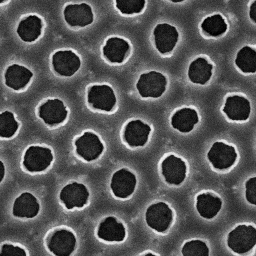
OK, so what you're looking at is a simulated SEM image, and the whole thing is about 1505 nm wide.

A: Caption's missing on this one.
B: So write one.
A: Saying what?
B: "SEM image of a regular array of holes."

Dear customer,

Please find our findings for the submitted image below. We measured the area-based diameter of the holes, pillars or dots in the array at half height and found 160 nanometers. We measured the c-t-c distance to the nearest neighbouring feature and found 288 nm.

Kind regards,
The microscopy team